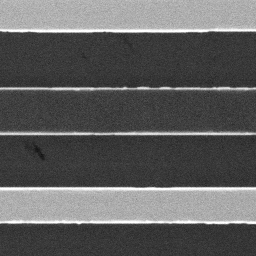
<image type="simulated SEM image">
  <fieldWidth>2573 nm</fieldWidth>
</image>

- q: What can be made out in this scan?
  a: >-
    lines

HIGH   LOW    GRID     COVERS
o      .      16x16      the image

oooooooooooooooo
oooooooooooooooo
................
................
................
........o.o.....
oooooooooooooooo
oooooooooooooooo
................
................
................
................
oooooooooooooooo
oooooooooooooooo
................
................